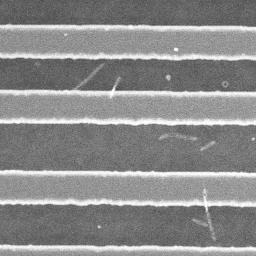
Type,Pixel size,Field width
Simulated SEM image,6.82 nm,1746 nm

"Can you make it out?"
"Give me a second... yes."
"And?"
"lines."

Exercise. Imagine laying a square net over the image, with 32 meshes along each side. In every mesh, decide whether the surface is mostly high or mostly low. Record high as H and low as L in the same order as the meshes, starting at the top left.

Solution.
LLLLLLLLLLLLLLLLLLLLLLLLLLLLLLLL
LLLLLLLLLLLLLLLLLLLLLLLLLLLLLLLL
LLLLLLLLLLLLLLLLLLLLLLLLLLLLLLLL
HHHHHHHHHHHHHHHHHHHHHHHHHHHHHHHH
HHHHHHHHHHHHHHHHHHHHHHHHHHHHHHHH
HHHHHHHHHHHHHHHHHHHHHHHHHHHHHHHH
HHHHHHHHHHHHHHHHHHHHHHHHHHHHHHHH
LLLLLLLLLLLLLLLLLLLLLLLLLLLLLLLL
LLLLLLLLLLLLLLLLLLLLLLLLLLLLLLLL
LLLLLLLLLLLLLLLLLLLLLLLLLLLLLLLL
LLLLLLLLLLLLLLLLLLLLLLLLLLLLLLLL
HHHHHHHHHHHHHHHHHHHHHLLLLLLLLLLL
HHHHHHHHHHHHHHHHHHHHHHHHHHHHHHHH
HHHHHHHHHHHHHHHHHHHHHHHHHHHHHHHH
HHHHHHHHHHHHHHHHHHHHHHHHHHHHHHHH
LLLLLLLLLLLLLLLLHLLLLHLLHLLLLLHL
LLLLLLLLLLLLLLLLLLLLLLLLLLLLLLLL
LLLLLLLLLLLLLLLLLLLLLLLLLLLLLLLL
LLLLLLLLLLLLLLLLLLLLLLLLLLLLLLLL
LLLLLLLLLLLLLLLLLLLLLLLLLLLLLLLL
LLLLLLLLLLLLLLLLLLLLLLLLLLLLLLLL
HHHHHHHHHHHHHHLLLHLLLLLLLLLLLLLL
HHHHHHHHHHHHHHHHHHHHHHHHHHHHHHHH
HHHHHHHHHHHHHHHHHHHHHHHHHHHHHHHH
HHHHHHHHHHHHHHHHHHHHHHHHHHHHHHHH
HHLLHHLHHHHHHHHHHHHHHHHHHHHHHHHH
LLLLLLLLLLLLLLLLLLLLLLLLLLLLLLLL
LLLLLLLLLLLLLLLLLLLLLLLLLLLLLLLL
LLLLLLLLLLLLLLLLLLLLLLLLLLLLLLLL
LLLLLLLLLLLLLLLLLLLLLLLLLLLLLLLL
LLLLLLLLLLLLLLLLLLLLLLLLLLLLLLLL
HHHHHHHHHHHHHHHHHHHHHHHHHHHHHHHH